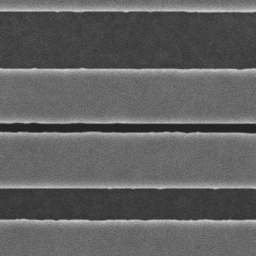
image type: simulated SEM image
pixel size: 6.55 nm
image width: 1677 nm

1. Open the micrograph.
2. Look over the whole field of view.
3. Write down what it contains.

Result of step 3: lines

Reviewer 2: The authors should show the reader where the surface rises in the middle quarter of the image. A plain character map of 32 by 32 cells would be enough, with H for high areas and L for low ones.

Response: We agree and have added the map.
LLLLLLLLLLLLLLLLLLLLLLLLLLLLLLLL
HHHHHHHHHHHHHHHHHHHHHHHHHHHHHHHH
HHHHHHHHHHHHHHHHHHHHHHHHHHHHHHHH
HHHHHHHHHHHHHHHHHHHHHHHHHHHHHHHH
HHHHHHHHHHHHHHHHHHHHHHHHHHHHHHHH
HHHHHHHHHHHHHHHHHHHHHHHHHHHHHHHH
HHHHHHHHHHHHHHHHHHHHHHHHHHHHHHHH
HHHHHHHHHHHHHHHHHHHHHHHHHHHHHHHH
HHHHHHHHHHHHHHHHHHHHHHHHHHHHHHHH
HHHHHHHHHHHHHHHHHHHHHHHHHHHHHHHH
HHHHHHHHHHHHHHHHHHHHHHHHHHHHHHHH
HHHHHHHHHHHHHHHHHHHHHHHHHHHHHHHH
HHHHHHHHHHHHHHHHHHHHHHHHHHHHHHHH
HHHHHHHHHHHHHHHHHHHHHHHHHHHHHHHH
HHHHHHHHHHHHHHHHHHHHHHHHHHHHHHHH
LLLLLLLLLLLLLLLLLLLLLLLLLLLLLLLL
LLLLLLLLLLLLLLLLLLLLLLLLLLLLLLLL
HHHHHHHHHHHHHHHHHHHHHHHHHHHHHHHH
HHHHHHHHHHHHHHHHHHHHHHHHHHHHHHHH
HHHHHHHHHHHHHHHHHHHHHHHHHHHHHHHH
HHHHHHHHHHHHHHHHHHHHHHHHHHHHHHHH
HHHHHHHHHHHHHHHHHHHHHHHHHHHHHHHH
HHHHHHHHHHHHHHHHHHHHHHHHHHHHHHHH
HHHHHHHHHHHHHHHHHHHHHHHHHHHHHHHH
HHHHHHHHHHHHHHHHHHHHHHHHHHHHHHHH
HHHHHHHHHHHHHHHHHHHHHHHHHHHHHHHH
HHHHHHHHHHHHHHHHHHHHHHHHHHHHHHHH
HHHHHHHHHHHHHHHHHHHHHHHHHHHHHHHH
HHHHHHHHHHHHHHHHHHHHHHHHHHHHHHHH
HHHHHHHHHHHHHHHHHHHHHHHHHHHHHHHH
HHHHHHHHHHHHHHHHHHHHHHHHHHHHHHHH
LLLLLLLLLLLLLLLLLLLLLLLLLLLLLLLL